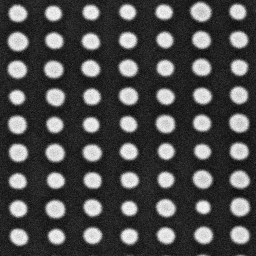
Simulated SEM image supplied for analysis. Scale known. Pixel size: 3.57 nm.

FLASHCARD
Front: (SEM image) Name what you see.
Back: a regular array of raised bodies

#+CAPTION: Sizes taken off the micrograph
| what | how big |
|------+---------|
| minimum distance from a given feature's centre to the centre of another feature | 0.099 µm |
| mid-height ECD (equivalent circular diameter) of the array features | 59.2 nanometres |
